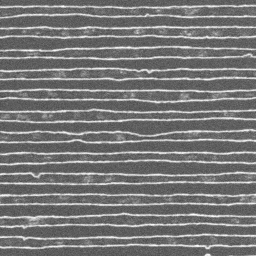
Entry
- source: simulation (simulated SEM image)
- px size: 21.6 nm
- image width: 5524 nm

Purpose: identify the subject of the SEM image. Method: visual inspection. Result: parallel lines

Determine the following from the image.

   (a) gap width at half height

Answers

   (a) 189 nanometres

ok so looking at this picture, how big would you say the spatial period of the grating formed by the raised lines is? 451 nanometers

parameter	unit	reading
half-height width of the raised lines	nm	259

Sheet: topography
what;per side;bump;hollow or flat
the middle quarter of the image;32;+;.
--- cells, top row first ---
++++++++++++++++++++++++++++++++
..................++++++++......
................................
................................
++++++++++++++++++++++++++++++++
++++++++++++++++++++++++++++++++
......+++++++++++++++++.++++++++
................................
................................
+++++++++++++++++++++++..+++++++
++++++++++++++++++++++++++++++++
++++++....++++++++++++++++++++++
................................
................................
+.+++..+.+++++++++++++++++++++++
++++++++++++++++++++++++++++++++
++++++++++++++++++++++++++++++++
..................+++++++.......
................................
.++++.........++++++++++++++++++
++++++++++++++++++++++++++++++++
++++++++++++++++++++++++++++++++
................................
................................
...+......++++++++++++++++++++++
++++++++++++++++++++++++++++++++
++++++++++++++++++++++++++++++++
...............+++++++++++++++++
................................
..............................+.
++++++++++++++++++++++++++++++++
++++++++++++++++++++++++++++++++